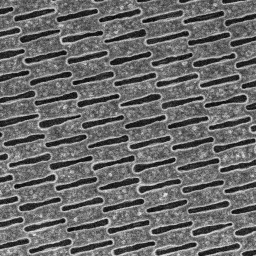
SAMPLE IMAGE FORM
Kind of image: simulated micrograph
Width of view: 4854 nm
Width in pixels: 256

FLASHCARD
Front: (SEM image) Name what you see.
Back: a regular array of holes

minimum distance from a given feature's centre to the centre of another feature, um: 0.411